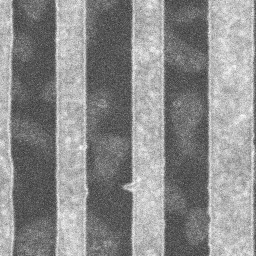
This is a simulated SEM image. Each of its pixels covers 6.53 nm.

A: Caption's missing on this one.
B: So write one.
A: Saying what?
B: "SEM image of one or a few lines or trenches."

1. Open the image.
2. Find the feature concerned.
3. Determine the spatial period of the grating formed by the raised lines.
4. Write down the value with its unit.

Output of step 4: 496 nanometers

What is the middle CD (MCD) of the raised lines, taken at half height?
314 nanometres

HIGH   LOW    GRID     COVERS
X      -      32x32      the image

-XXXXXX----XXXXXX---XXXXXX------
-XXXXXX----XXXXXX---XXXXXX------
-XXXXXX----XXXXXX---XXXXXX------
-XXXXXX----XXXXXX---XXXXXX------
-XXXXXX----XXXXXX---XXXXXX------
-XXXXXX----XXXXXX---XXXXXX------
-XXXXXX----XXXXXX---XXXXXX------
-XXXXXX----XXXXXX---XXXXXX------
-XXXXXX----XXXXXX---XXXXXX------
-XXXXXX----XXXXXX---XXXXXX------
-XXXXXX----XXXXXX---XXXXXX------
-XXXXXX----XXXXXX---XXXXXX------
-XXXXXX----XXXXXX---XXXXXX------
-XXXXXX----XXXXXX---XXXXXX------
-XXXXXX----XXXXXX---XXXXXX------
-XXXXXX----XXXXXX---XXXXXX------
-XXXXXX----XXXXXX---XXXXXX------
-XXXXXX----XXXXXX---XXXXXX------
-XXXXXX----XXXXXX---XXXXXX------
-XXXXXX----XXXXXX---XXXXXX------
-XXXXXX----XXXXXX---XXXXXX------
-XXXXXX----XXXXXX---XXXXXX------
-XXXXXX----XXXXXX---XXXXXX------
-XXXXXX----XXXXX----XXXXXX------
-XXXXXX----XXXXXX---XXXXXX------
-XXXXXX----XXXXXX---XXXXXX------
-XXXXXX----XXXXXX---XXXXXX------
--XXXXX----XXXXXX---XXXXXX------
--XXXXX----XXXXXX---XXXXXX------
--XXXXX----XXXXXX---XXXXXX------
--XXXXX----XXXXXX---XXXXXX------
-XXXXXX----XXXXXX---XXXXXX------